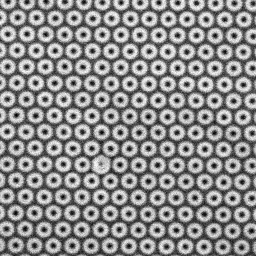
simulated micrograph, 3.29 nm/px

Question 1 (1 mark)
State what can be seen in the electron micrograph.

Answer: a regular array of ring-shaped raised bodies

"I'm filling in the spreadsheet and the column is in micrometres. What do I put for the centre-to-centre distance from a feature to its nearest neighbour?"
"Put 0.0608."